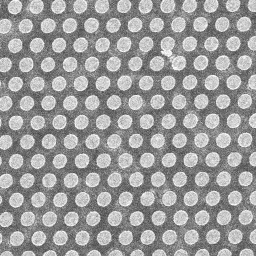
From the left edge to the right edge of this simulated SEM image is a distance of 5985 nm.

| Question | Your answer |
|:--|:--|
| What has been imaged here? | a regular array of raised bodies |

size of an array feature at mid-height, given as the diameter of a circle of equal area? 323 nanometers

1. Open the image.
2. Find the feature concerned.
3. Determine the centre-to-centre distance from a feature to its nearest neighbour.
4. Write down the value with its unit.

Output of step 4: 0.506 um